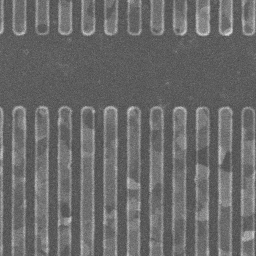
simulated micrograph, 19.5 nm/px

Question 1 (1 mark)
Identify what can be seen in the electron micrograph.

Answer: parallel lines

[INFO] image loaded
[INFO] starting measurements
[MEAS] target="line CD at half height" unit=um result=0.215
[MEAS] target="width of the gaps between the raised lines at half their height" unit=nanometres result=232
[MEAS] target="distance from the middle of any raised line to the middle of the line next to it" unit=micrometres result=0.447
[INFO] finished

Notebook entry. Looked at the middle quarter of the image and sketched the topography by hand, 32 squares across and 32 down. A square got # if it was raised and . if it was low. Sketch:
................................
................................
................................
................................
................................
................................
................................
................................
................................
................................
................................
##...##....##...###...##....##..
##...##...###...###...##...###..
##...##...###...###...##....##..
##...##...###...###...##....##..
##...##...###...###...##....##..
##...##...###...###...##....##..
##...##...###...###...###...##..
##...##...###...###...##....##..
##...##...###...###...##...###..
##...##...###...###...##...###..
##...##...###...###...##...###..
##...##...###...###...##....##..
##...##...###...###...##....##..
##...##...###...###...##....##..
#....##...###...###...##....##..
##..###...###...###...##....##..
##...##...###...###...###...##..
##...##...###...###...##...###..
##...##...###...###...##....##..
#...###...###...###...##....##..
#....##...###...###...##....##..